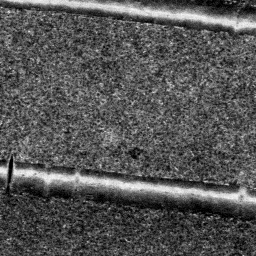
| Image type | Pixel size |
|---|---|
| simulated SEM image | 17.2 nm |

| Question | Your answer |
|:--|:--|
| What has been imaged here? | one or a few lines or trenches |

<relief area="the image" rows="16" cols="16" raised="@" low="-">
@@@@@@@---------
@@@@@@@@@@@@@@@-
@@@@@@@@@@@@@@@@
@@@@@@@@@@@@@@@@
@@@@@@@@@@@@@@@@
@@@@@@@@@@@@@@@@
@@@@@@@@@@@@@@@@
@@@@@@@@@@@@@@@@
@@@@@@@@@@@@@@@@
@@@@@@@@@@@@@@@@
@@@@@@@@@@@@@@@@
-------@@@@@@@@@
----------------
----------------
----------------
----------------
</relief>